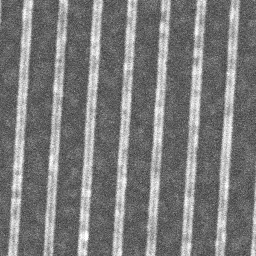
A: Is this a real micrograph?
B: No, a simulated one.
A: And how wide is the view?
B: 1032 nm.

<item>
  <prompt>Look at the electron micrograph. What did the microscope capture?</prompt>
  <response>parallel lines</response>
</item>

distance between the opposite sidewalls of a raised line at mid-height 0.0256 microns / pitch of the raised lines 139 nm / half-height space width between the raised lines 110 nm